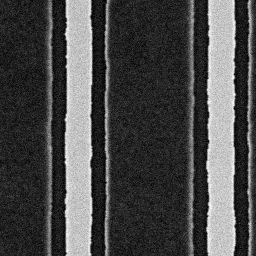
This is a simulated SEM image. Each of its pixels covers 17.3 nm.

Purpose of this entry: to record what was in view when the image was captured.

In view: lines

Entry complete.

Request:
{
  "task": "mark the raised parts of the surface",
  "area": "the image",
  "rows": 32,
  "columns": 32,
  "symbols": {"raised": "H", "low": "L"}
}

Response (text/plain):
HHHHHHLLHHHLLHHHHHHHHHHHLLHHHLLH
HHHHHHLLHHHLLHHHHHHHHHHHLLHHHLLH
HHHHHHLLHHHLLHHHHHHHHHHHLLHHHLLH
HHHHHHLLHHHLLHHHHHHHHHHHLLHHHLLH
HHHHHHLLHHHLLHHHHHHHHHHHLLHHHLLH
HHHHHHLLHHHLLHHHHHHHHHHHLLHHHLLH
HHHHHHLLHHHLLHHHHHHHHHHHLLHHHLLH
HHHHHHLLHHHLLHHHHHHHHHHHLLHHHLLH
HHHHHHLLHHHLLHHHHHHHHHHHLLHHHLLH
HHHHHHLLHHHLLHHHHHHHHHHHLLHHHLLH
HHHHHHLLHHHLLHHHHHHHHHHHLLHHHLLH
HHHHHHLLHHHLLHHHHHHHHHHHLLHHHLLH
HHHHHHLLHHHLLHHHHHHHHHHHLLHHHLLH
HHHHHHLLHHHLLHHHHHHHHHHHLLHHHLLH
HHHHHHLLHHHLLHHHHHHHHHHHLLHHHLLH
HHHHHHLLHHHLLHHHHHHHHHHHLLHHHLLH
HHHHHHLLHHHLLHHHHHHHHHHHLLHHHLLH
HHHHHHLLHHHLLHHHHHHHHHHHLLHHHLLH
HHHHHHLLHHHLLHHHHHHHHHHHLLHHHLLH
HHHHHHLLHHHLLHHHHHHHHHHHLLHHHLLH
HHHHHHLLHHHLLHHHHHHHHHHHLLHHHLLH
HHHHHHLLHHHLLHHHHHHHHHHHLLHHHLLH
HHHHHHLLHHHLLHHHHHHHHHHHLLHHHLLH
HHHHHHLLHHHLLHHHHHHHHHHHLLHHHLLH
HHHHHHLLHHHLLHHHHHHHHHHHLLHHHLLH
HHHHHHLLHHHLLHHHHHHHHHHHLLHHHLLH
HHHHHHLLHHHLLHHHHHHHHHHHLLHHHLLH
HHHHHHLLHHHLLHHHHHHHHHHHLLHHHLLH
HHHHHHLLHHHLLHHHHHHHHHHHLLHHHLLH
HHHHHHLLHHHLLHHHHHHHHHHHLLHHHLLH
HHHHHHLLHHHLLHHHHHHHHHHHLLHHHLLH
HHHHHHLLHHHLLHHHHHHHHHHHLLHHHLLH